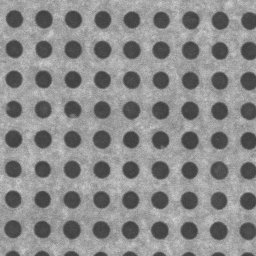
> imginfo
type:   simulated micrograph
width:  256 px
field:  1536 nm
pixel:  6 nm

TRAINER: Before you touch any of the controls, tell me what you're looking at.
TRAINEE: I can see a regular array of holes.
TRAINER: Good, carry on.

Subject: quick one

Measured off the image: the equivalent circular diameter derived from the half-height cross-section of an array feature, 108 nm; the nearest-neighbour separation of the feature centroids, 176 nanometres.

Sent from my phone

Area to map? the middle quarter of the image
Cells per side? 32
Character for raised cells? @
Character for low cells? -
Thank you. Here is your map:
@@@@@@@@@@@@@@@@@@@@@@@@@@@@@@@@
@@@@@@@@@@@@@@@@@@@@@@@@@@@@@@@@
----@@@@---@@@@---@@@@@---@@@@--
----@@@-----@@@----@@@----@@@---
----@@@@----@@@----@@@----@@@---
@---@@@@---@@@@----@@@----@@@@--
@@@@@@@@@@@@@@@@@@@@@@@@@@@@@@@-
@@@@@@@@@@@@@@@@@@@@@@@@@@@@@@@@
@@@@@@@@@@@@@@@@@@@@@@@@@@@@@@@@
@--@@@@@--@@@@@@--@@@@@--@@@@@--
----@@@-----@@@----@@@----@@@---
-----@@-----@@-----@@@----@@@---
----@@@-----@@@----@@@----@@@---
@--@@@@@---@@@@@--@@@@@---@@@@--
@@@@@@@@@@@@@@@@@@@@@@@@@@@@@@@@
@@@@@@@@@@@@@@@@@@@@@@@@@@@@@@@@
@@@@@@@@@-@@@@@@@@@@@@@@@@@@@@@@
----@@@-----@@@---@@@@@---@@@@--
----@@@-----@@@----@@@----@@@---
----@@@-----@@@----@@@----@@@---
@---@@@@---@@@@---@@@@----@@@@--
@@@@@@@@@@@@@@@@@@@@@@@@@@@@@@@@
@@@@@@@@@@@@@@@@@@@@@@@@@@@@@@@@
@@@@@@@@@@@@@@@@@@@@@@@@@@@@@@@@
@--@@@@@---@@@@---@@@@@--@@@@@@-
----@@@----@@@@----@@@----@@@@--
----@@@-----@@-----@@@----@@@---
----@@@----@@@@----@@@----@@@@--
@@-@@@@@---@@@@@--@@@@@--@@@@@--
@@@@@@@@@@@@@@@@@@@@@@@@@@@@@@@@
@@@@@@@@@@@@@@@@@@@@@@@@@@@@@@@@
@@@@@@@@@@@@@@@@@@@@@@@@@@@@@@@@